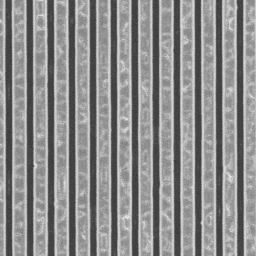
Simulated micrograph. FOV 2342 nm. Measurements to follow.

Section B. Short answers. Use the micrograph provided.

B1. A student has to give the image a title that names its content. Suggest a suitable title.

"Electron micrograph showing parallel lines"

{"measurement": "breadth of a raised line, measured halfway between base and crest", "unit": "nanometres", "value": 116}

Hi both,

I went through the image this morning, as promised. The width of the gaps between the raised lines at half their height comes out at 80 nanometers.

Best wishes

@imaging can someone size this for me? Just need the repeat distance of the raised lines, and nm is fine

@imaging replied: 192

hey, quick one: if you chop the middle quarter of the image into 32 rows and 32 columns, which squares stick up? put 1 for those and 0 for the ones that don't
10011100111000110001110011100011
10011100111000110001110011100011
10011100111000110001110011100011
10011100111000110001110011100011
10011100111000110001110011100011
10011100111000110001110011100011
10011100111000110001110011100011
10011100111000110001110011100011
10011100111000110001110011100011
10011100111000110001110011100011
10011100111000110001110011100011
10011100111000110001110011100011
10011100111000110001110011100111
10011100111000110001110011100011
10011100111000110001110011100011
10011100111000110001110011100011
10011100111000110001110011100011
10011100111000110001110011100011
10011100111000110001110011100011
10011100111000110001110011100011
10011100111000110001110011100011
10011100111000110001110011100011
10011100111000110001110011100011
10011100111000110001110011100011
10011100111000111001110011100011
10011100111000111001110011100011
10011100011000110001110011100011
10011100011000110001110011100011
10011100011000110001110011100011
10011100011000111001110011100011
10011100011000111001110011100011
10011100011000111001110011100111